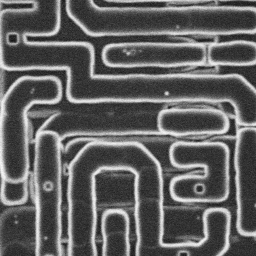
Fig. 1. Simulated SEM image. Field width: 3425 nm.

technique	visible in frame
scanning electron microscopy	wiring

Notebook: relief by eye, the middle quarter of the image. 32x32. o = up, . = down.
ooooooo....ooooooo......ooo.....
.oooooo.........................
.oooooo.........................
.ooooooooooooooooooooooooooooooo
.ooooooooooooooooooooooooooooooo
.ooooooooooooooooooooooooooooooo
.ooooooooooooooooooooooooooooooo
.ooooooooooooooooooooooooooooooo
.ooooooooooooooooooooooooooooooo
..oo............................
................................
...............................o
........................oooooooo
........................oooooooo
........................oooooooo
........................oooooooo
........................oooooooo
...........................oooo.
................................
................................
.....oooooooooooooo........ooooo
....oooooooooooooooo.......ooooo
....ooooooooooooooooo......ooooo
...ooooooooooooooooooo.....ooooo
..ooooooooooooooooooooo....ooooo
..oooooooooooooooooooooo....ooo.
..ooooooo........ooooooo........
..oooooo..........oooooo........
.oooooo...........oooooo....oooo
.oooooo...........oooooo...ooooo
.oooooo...........oooooo...ooooo
.oooooo...........oooooo...ooooo